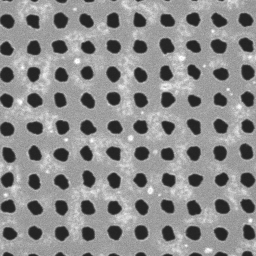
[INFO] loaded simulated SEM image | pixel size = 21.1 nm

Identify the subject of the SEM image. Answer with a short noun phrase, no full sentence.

a regular array of holes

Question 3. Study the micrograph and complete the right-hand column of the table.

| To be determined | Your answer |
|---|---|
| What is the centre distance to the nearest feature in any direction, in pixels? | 25.5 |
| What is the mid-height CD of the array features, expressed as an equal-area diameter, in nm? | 307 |